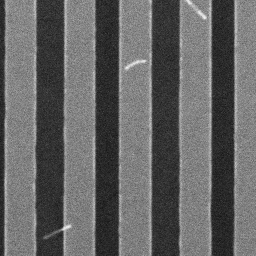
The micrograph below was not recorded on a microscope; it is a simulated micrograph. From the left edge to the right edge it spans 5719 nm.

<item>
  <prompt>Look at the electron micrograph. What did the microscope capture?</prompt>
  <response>lines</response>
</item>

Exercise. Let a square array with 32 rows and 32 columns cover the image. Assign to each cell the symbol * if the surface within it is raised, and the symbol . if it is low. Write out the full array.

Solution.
.***....****...****....***...***
.***....****...****....***...***
.***....****...****....***...***
.***....****...****....***...***
.***....****...****....***...***
.***....****...****....***...***
.***....****...****....***...***
.***....****...****....***...***
.***....****...****....***...***
.***....****...****....***...***
.***....****...****....***...***
.***....****...****...****...***
.***....****...****...****...***
.***....****...****...****...***
.***....****...****...****...***
.***....****...****...****...***
.***....****...****...****...***
.***....****...****...****...***
.***....****...****...****...***
.***....****...****....***...***
.***....****...****....***...***
.***....****...****....***...***
.***....****...****....***...***
.***....****...****....***...***
.***....****...****....***...***
.***....****...****...****...***
.***....****...****...****...***
.***....****...****...****...***
.***....****...****....***...***
.***....****...****...****...***
.***....****...****...****...***
.***....****...****....***...***